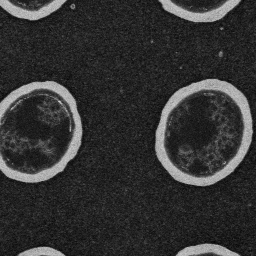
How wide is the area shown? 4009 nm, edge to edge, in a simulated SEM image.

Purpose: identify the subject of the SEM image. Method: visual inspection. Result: raised bodies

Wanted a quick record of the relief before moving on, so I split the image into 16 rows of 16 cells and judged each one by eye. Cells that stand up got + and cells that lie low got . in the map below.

.++........+++..
................
................
................
................
..+.........++..
+++++......++++.
+++++.....+++++.
+++++.....+++++.
++++......+++++.
++++.......+++..
................
................
................
................
................